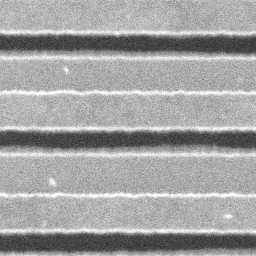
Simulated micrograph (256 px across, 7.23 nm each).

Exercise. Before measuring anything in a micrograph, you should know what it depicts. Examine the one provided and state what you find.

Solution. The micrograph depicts lines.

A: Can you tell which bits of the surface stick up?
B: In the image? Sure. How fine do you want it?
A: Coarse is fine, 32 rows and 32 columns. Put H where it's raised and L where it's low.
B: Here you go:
HHHHHHHHHHHHHHHHHHHHHHHHHHHHHHHH
HHHHHHHHHHHHHHHHHHHHHHHHHHHHHHHH
HHHHHHHHHHHHHHHHHHHHHHHHHHHHHHHH
HHHHHHHHHHHHHHHHHHHHHHHHHHHHHHHH
LLLLLLLLLLLLLLLLLLLLLLLLLLLLLLLL
LLLLLLLLLLLLLLLLLLLLLLLLLLLLLLLL
LLLLLLLLLLLLLLLLLLLLLLLLLLLLLLLL
HHHHHHHHHHHHHHHHHHHHHHHHHHHHHHHH
HHHHHHHHHHHHHHHHHHHHHHHHHHHHHHHH
HHHHHHHHHHHHHHHHHHHHHHHHHHHHHHHH
HHHHHHHHHHHHHHHHHHHHHHHHHHHHHHHH
HHHHHHHHHHHHHHHHHHHHHHHHHHHHHHHH
HHHHHHHHHHHHHHHHHHHHHHHHHHHHHHHH
HHHHHHHHHHHHHHHHHHHHHHHHHHHHHHHH
HHHHHHHHHHHHHHHHHHHHHHHHHHHHHHHH
HHHHHHHHHHHHHHHHHHHHHHHHHHHHHHHH
LLLLLLLLLLLLLLLLLLLLLLLLLLLLLLLL
LLLLLLLLLLLLLLLLLLLLLLLLLLLLLLLL
LLLLLLLLLLLLLLLLLLLLLLLLLLLLLLLL
HHHHHHHHHHHHHHHHHHHHHHHHHHHHHHHH
HHHHHHHHHHHHHHHHHHHHHHHHHHHHHHHH
HHHHHHHHHHHHHHHHHHHHHHHHHHHHHHHH
HHHHHHHHHHHHHHHHHHHHHHHHHHHHHHHH
HHHHHHHHHHHHHHHHHHHHHHHHHHHHHHHH
HHHHHHHHHHHHHHHHHHHHHHHHHHHHHHHH
HHHHHHHHHHHHHHHHHHHHHHHHHHHHHHHH
HHHHHHHHHHHHHHHHHHHHHHHHHHHHHHHH
HHHHHHHHHHHHHHHHHHHHHHHHHHHHHHHH
HHHHHHHHHHHHHHHHHHHHHHHHHHHHHHHH
LLLLLLLLLLLLLLLLLLLLLLLLLLLLLLLL
LLLLLLLLLLLLLLLLLLLLLLLLLLLLLLLL
LLLLLLLLLLLLLLLLLLLLLLLLLLLLLLLL